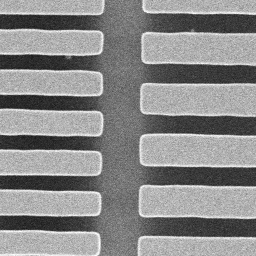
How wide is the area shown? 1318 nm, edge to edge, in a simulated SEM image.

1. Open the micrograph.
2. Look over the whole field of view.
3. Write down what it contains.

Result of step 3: groups of lines, slits or small figures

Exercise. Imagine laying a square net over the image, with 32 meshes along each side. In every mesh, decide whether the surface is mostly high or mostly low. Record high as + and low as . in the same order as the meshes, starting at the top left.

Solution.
+++++++++++++.....++++++++++++++
+++++++++++++.....++++++++++++++
................................
................................
+++++++++++++.....++++++++++++++
+++++++++++++.....++++++++++++++
++++++++++++......++++++++++++++
..................++++++++++++++
................................
+++++++++++++...................
+++++++++++++...................
+++++++++++++.....++++++++++++++
..................++++++++++++++
..................++++++++++++++
+++++++++++++...................
+++++++++++++...................
+++++++++++++...................
..................++++++++++++++
..................++++++++++++++
+++++++++++++.....++++++++++++++
+++++++++++++.....++++++++++++++
++++++++++++....................
................................
..................++++++++++++++
++++++++++++.....+++++++++++++++
+++++++++++++....+++++++++++++++
++++++++++++.....+++++++++++++++
................................
................................
++++++++++++....................
++++++++++++.....+++++++++++++++
++++++++++++.....+++++++++++++++